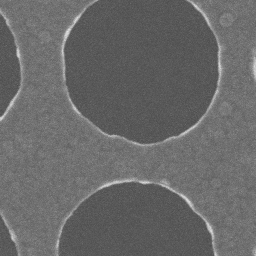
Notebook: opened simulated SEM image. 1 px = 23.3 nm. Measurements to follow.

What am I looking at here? holes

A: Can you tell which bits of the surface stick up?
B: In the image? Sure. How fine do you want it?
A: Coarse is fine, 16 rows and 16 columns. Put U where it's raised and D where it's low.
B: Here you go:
UUUUUDDDDDDDUUUU
UUUUUDDDDDDDDUUU
DUUUDDDDDDDDDDUU
DUUUDDDDDDDDDDUU
DUUUDDDDDDDDDDUU
DUUUDDDDDDDDDDUU
DUUUUDDDDDDDDUUU
UUUUUUDDDDDDUUUU
UUUUUUUDDDDUUUUU
UUUUUUUUUUUUUUUU
UUUUUUUUUUUUUUUU
UUUUUUUDDDUUUUUU
UUUUUDDDDDDDUUUU
UUUUDDDDDDDDDUUU
DUUUDDDDDDDDDUUU
DUUUDDDDDDDDDUUU